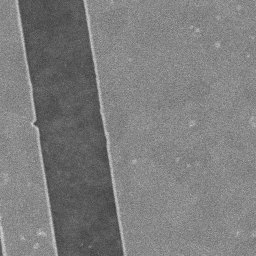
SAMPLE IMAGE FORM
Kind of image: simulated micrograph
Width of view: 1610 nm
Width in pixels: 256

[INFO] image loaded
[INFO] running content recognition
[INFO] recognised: one or a few lines or trenches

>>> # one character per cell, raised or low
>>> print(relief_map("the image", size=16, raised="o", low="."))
o....ooooooooooo
o.....oooooooooo
o.....oooooooooo
oo....oooooooooo
oo....oooooooooo
oo....oooooooooo
oo....oooooooooo
oo....oooooooooo
oo.....ooooooooo
ooo....ooooooooo
ooo....ooooooooo
ooo....ooooooooo
ooo....ooooooooo
ooo....ooooooooo
ooo.....oooooooo
ooo.....oooooooo